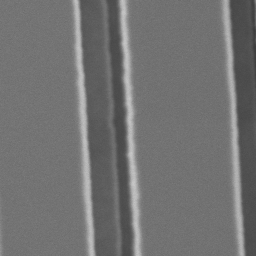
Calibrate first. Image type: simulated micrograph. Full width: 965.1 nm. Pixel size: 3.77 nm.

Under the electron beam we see lines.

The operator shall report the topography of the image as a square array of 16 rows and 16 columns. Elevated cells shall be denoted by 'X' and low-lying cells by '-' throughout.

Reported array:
XXXXX---XXXXXX--
XXXXX---XXXXXX--
XXXXX---XXXXXX--
XXXXX---XXXXXXX-
XXXXX---XXXXXXX-
XXXXX---XXXXXXX-
XXXXX---XXXXXXX-
XXXXX---XXXXXXX-
XXXXX---XXXXXXX-
XXXXX---XXXXXXX-
XXXXXX--XXXXXXX-
XXXXXX--XXXXXXX-
XXXXXX--XXXXXXX-
XXXXXX--XXXXXXX-
XXXXXX--XXXXXXX-
XXXXXX--XXXXXXX-